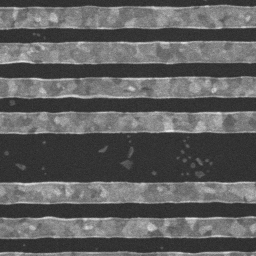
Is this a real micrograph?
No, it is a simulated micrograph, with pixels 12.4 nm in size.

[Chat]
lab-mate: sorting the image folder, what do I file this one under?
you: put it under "wiring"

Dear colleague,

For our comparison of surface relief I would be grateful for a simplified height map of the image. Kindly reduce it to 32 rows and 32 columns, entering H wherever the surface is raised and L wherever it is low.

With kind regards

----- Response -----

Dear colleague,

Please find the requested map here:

LLLLLLLLLLLLLLLLLLLLLLLLLLLLLLLL
HHHHHHHHHHHHHHHHHHHHHHHHHHHHHHHH
HHHHHHHHHHHHHHHHHHHHHHHHHHHHHHHH
HHLLHLLLLLHHHHHLLLHHLLLLLHHLLLLL
LLLLLLLLLLLLLLLLLLLLLLLLLLLLLLLL
HHHHHHHHHHHHHHHHHHHHHHHHHHHHHHHH
HHHHHHHHHHHHHHHHHHHHHHHHHHHHHHHH
HHHHHHHHHHHHHHHHHHHHHHHHHHHHHHHH
LLLLLLLLLLLLLLLLLLLLLLLLLLLLLLLL
LLLLLLLLLLLLLLLLLLLLLLLLLLLLLLLL
HHHHHHHHHHHHHHHHHHHHHHHHHHHHHHHH
HHHHHHHHHHHHHHHHHHHHHHHHHHHHHHHH
LLLLLLLLLLLLLLLLLLLLLLLLLLLLLLLL
LLLLLLLLLLLLLLLLLLLLLLLLLLLLLLLL
HHHHHHHHHHHHHHHHHHHHHHHHHHHHHHHH
HHHHHHHHHHHHHHHHHHHHHHHHHHHHHHHH
HHHHHHHHHHHHLLLLLLLLLLLLLLLLLLLL
LLLLLLLLLLLLLLLLLLLLLLLLLLLLLLLL
LLLLLLLLLLLLLLLLLLLLLLLLLLLLLLLL
LLLLLLLLLLLLLLLLLLLLLLLLLLLLLLLL
LLLLLLLLLLLLLLLLLLLLLLLLLLLLLLLL
LLLLLLLLLLLLLLLLLLLLLLLLLLLLLLLL
LLLLLLLLLLLLLLLLLLLLLLLLLLLLLLLL
HHHHHHHHHHHHHHHHHHHHHHHHHHHHHHHH
HHHHHHHHHHHHHHHHHHHHHHHHHHHHHHHH
LLLLLLLLLLLLLLLLLLLLLLLLLLLLLLLL
LLLLLLLLLLLLLLLLLLLLLLLLLLLLLLLL
HHHHHHHHLHHHHHHHHHHHHHHHHHHHHHHH
HHHHHHHHHHHHHHHHHHHHHHHHHHHHHHHH
HHHHHHHHHHHHHHHHHHHHHHHHHHHHHHHH
LLLLLLLLLLLLLLLLLLLLLLLLLLLLLLLL
LLLLLLLLLLLLLLLLLLLLLLLLLLLLLLLL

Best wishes